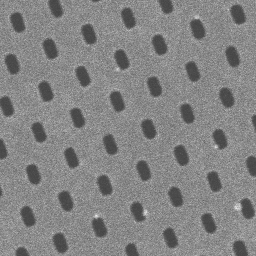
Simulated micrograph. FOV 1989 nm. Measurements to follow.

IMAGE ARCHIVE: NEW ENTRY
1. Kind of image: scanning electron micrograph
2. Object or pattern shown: a regular array of holes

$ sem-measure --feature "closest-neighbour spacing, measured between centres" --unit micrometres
0.319